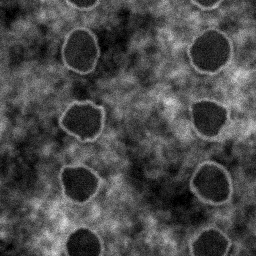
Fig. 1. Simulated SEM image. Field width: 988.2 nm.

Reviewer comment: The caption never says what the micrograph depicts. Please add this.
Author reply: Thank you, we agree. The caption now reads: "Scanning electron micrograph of raised bodies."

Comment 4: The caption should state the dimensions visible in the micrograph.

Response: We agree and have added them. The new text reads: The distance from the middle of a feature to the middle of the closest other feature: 255 nanometers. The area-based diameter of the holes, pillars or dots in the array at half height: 155 nanometers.